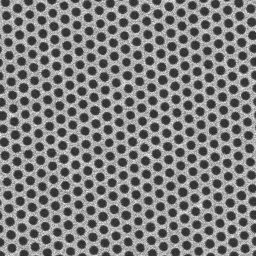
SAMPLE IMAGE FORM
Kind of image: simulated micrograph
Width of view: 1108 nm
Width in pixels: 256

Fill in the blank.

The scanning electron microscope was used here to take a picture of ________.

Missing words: a regular array of holes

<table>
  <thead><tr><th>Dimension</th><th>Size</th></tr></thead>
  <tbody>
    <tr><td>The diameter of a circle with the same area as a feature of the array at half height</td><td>39.1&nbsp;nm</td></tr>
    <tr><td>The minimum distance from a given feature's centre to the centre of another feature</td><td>56.8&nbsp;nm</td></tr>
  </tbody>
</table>